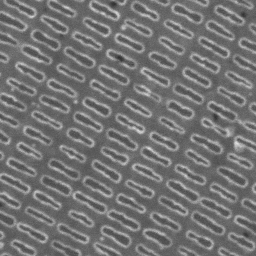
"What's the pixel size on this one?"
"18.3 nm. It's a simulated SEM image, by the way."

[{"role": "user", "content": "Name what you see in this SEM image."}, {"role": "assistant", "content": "a regular array of holes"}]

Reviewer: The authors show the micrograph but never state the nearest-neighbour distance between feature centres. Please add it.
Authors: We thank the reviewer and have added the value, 0.323 micrometres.